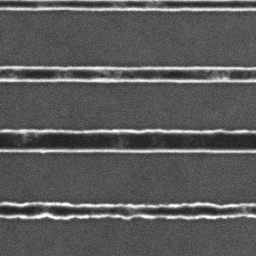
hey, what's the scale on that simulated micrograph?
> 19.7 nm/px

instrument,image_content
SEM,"one or a few lines or trenches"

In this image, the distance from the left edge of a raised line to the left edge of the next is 1350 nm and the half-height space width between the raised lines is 1050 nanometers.